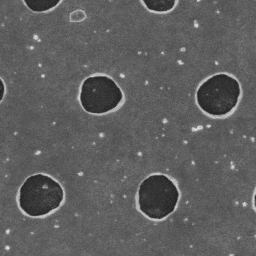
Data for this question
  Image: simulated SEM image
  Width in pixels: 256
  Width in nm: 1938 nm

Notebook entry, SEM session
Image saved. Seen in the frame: holes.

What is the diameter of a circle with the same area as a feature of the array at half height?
324 nm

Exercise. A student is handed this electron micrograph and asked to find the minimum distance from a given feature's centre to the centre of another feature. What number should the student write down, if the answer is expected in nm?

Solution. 888